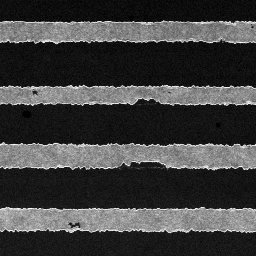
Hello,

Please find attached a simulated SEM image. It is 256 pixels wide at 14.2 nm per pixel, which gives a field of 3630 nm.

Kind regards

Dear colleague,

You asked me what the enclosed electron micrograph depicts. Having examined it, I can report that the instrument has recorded one or a few lines or trenches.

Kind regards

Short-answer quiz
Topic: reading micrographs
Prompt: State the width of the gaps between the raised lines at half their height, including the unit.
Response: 592 nm